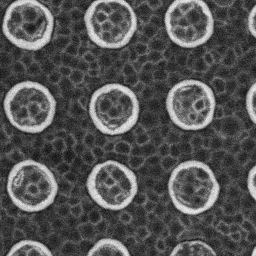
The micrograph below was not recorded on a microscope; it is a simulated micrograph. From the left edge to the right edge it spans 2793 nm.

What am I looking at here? raised bodies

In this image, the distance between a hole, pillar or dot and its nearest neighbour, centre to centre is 852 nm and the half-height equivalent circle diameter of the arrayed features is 46.4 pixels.